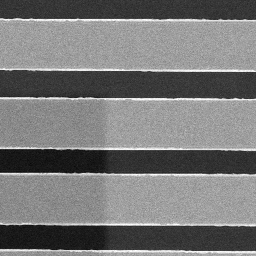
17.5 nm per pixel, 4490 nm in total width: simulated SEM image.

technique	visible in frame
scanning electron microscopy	lines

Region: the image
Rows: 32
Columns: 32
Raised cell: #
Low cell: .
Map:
................................
................................
##########################.#..#.
################################
################################
################################
################################
################################
################################
................................
................................
................................
################################
################################
################################
################################
################################
################################
################################
................................
................................
................................
################################
################################
################################
################################
################################
################################
................................
................................
................................
################################